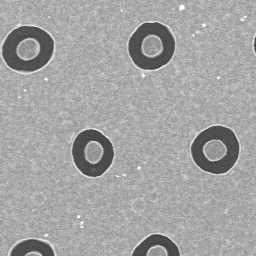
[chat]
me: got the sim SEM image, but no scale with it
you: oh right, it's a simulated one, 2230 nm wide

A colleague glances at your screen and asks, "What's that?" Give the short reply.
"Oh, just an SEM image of ring-shaped grooves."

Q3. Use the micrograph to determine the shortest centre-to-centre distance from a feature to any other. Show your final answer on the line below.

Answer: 1070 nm